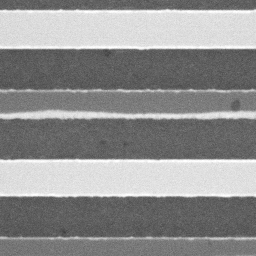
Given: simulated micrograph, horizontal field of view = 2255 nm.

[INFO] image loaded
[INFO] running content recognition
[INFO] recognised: lines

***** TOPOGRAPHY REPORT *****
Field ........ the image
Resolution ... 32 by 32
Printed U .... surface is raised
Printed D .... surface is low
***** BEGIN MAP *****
DDDDDDDDDDDDDDDDDDDDDDDDDDDDDDDD
UUUUUUUUUUUUUUUUUUUUUUUUUUUUUUUU
UUUUUUUUUUUUUUUUUUUUUUUUUUUUUUUU
UUUUUUUUUUUUUUUUUUUUUUUUUUUUUUUU
UUUUUUUUUUUUUUUUUUUUUUUUUUUUUUUU
UUUUUUUUUUUUUUUUUUUUUUUUUUUUUUUU
DDDDDDDDDDDDDDDDDDDDDDDDDDDDDDDD
DDDDDDDDDDDDDDDDDDDDDDDDDDDDDDDD
DDDDDDDDDDDDDDDDDDDDDDDDDDDDDDDD
DDDDDDDDDDDDDDDDDDDDDDDDDDDDDDDD
DDDDDDDDDDDDDDDDDDDDDDDDDDDDDDDD
UUUUUUUUUUUUUUUUUUUUUUUUUUUUUUUU
UUUUUUUUUUUUUUUUUUUUUUUUUUUUUUUU
UUUUUUUUUUUUUUUUUUUUUUUUUUUUUUUU
UUUUDDDDDDDDDUUUUUUUUUUUUUUDDDDD
DDDDDDDDDDDDDDDDDDDDDDDDDDDDDDDD
DDDDDDDDDDDDDDDDDDDDDDDDDDDDDDDD
DDDDDDDDDDDDDDDDDDDDDDDDDDDDDDDD
DDDDDDDDDDDDDDDDDDDDDDDDDDDDDDDD
DDDDDDDDDDDDDDDDDDDDDDDDDDDDDDDD
UUUUUUUUUUUUUUUUUUUUUUUUUUUUUUUU
UUUUUUUUUUUUUUUUUUUUUUUUUUUUUUUU
UUUUUUUUUUUUUUUUUUUUUUUUUUUUUUUU
UUUUUUUUUUUUUUUUUUUUUUUUUUUUUUUU
DDDDDDDUUUDUUUUUDDDUUDDUUDDUUDUD
DDDDDDDDDDDDDDDDDDDDDDDDDDDDDDDD
DDDDDDDDDDDDDDDDDDDDDDDDDDDDDDDD
DDDDDDDDDDDDDDDDDDDDDDDDDDDDDDDD
DDDDDDDDDDDDDDDDDDDDDDDDDDDDDDDD
DDDDDDDDDDDDDDDDDDDDDDDDDDDDDDDD
UUUUUUUUUUUUUUUUUUUUUUUUUUUUUUUU
UUUUUUUUUUUUUUUUUUUUUUUUUUUUUUUU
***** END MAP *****